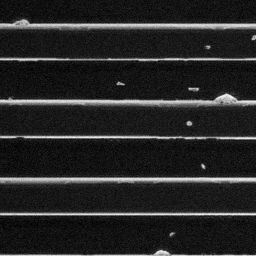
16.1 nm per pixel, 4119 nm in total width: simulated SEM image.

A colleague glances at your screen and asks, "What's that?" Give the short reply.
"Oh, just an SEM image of lines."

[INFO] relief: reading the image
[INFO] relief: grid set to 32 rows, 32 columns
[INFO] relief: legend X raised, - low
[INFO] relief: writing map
--------------------------------
--------------------------------
--------------------------------
XXXXXXXXXXXXXXXXXXXXXXXXXXXXXXXX
XXXXXXXXXXXXXXXXXXXXXXXXXXXXXXXX
XXXXXXXXXXXXXXXXXXXXXXXXXXXXXXXX
XXXXXXXXXXXXXXXXXXXXXXXXXXXXXXXX
--------------------------------
--------------------------------
--------------------------------
--------------------------------
--------------------------------
---------------------------XX---
XXXXXXXXXXXXXXXXXXXXXXXXXXXXXXXX
XXXXXXXXXXXXXXXXXXXXXXXXXXXXXXXX
XXXXXXXXXXXXXXXXXXXXXXXXXXXXXXXX
XXXXXXXXXXXXXXXXXXXXXXXXXXXXXXXX
--------------------------------
--------------------------------
--------------------------------
--------------------------------
--------------------------------
X------XXXXXXXXXXXXXXXXXXXXXXXXX
XXXXXXXXXXXXXXXXXXXXXXXXXXXXXXXX
XXXXXXXXXXXXXXXXXXXXXXXXXXXXXXXX
XXXXXXXXXXXXXXXXXXXXXXXXXXXXXXXX
XXXXXXXXXXXXXXXXXXXXXXXXXXXXXXXX
--------------------------------
--------------------------------
--------------------------------
--------------------------------
--------------------------------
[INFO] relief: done